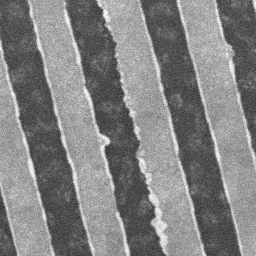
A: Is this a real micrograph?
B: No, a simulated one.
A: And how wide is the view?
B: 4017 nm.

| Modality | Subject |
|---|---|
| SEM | one or a few lines or trenches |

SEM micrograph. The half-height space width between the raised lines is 583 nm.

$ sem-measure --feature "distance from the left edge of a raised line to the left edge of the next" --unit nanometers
1130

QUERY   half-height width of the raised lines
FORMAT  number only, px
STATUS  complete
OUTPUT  36.1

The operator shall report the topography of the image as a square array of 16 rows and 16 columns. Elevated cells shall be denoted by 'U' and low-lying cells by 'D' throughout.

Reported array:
DDUUDDUUUDDUUUDD
DDUUDDDUUDDUUUDD
DDUUUDDUUDDDUUDD
DDDUUDDUUUDDUUUD
DDDUUDDUUUDDUUUD
UDDUUDDDUUDDUUUD
UDDUUUDDUUDDDUUD
UDDDUUDDUUUDDUUD
UUDDUUDDDUUDDUUU
UUDDUUDDDUUDDDUU
UUDDDUUDDUUDDDUU
UUDDDUUDDUUUDDUU
UUUDDUUDDDUUDDUU
DUUDDUUDDDUUDDDU
DUUDDUUUDDUUDDDU
DUUDDDUUDDUUUDDU